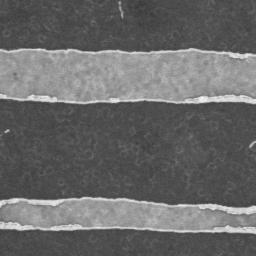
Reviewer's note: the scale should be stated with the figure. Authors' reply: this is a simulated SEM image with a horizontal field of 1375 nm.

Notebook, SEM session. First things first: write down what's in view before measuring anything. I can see one or a few lines or trenches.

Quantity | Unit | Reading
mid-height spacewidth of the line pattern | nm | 546